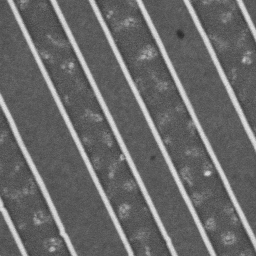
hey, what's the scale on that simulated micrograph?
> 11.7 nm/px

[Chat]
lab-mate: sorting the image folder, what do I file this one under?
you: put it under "one or a few lines or trenches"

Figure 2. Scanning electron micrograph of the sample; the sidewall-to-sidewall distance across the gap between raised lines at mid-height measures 0.498 micrometres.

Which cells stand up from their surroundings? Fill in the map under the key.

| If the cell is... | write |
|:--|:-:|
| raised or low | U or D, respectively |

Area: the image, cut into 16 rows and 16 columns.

UDDDUUDDDUUUDDDU
UDDDUUDDDUUUDDDD
UUDDDUUDDDUUUDDD
UUDDDUUDDDUUUDDD
UUUDDUUUDDDUUUDD
UUUDDDUUDDDUUUDD
UUUUDDUUUDDDUUUD
DUUUDDDUUDDDUUUD
DUUUUDDUUUDDDUUU
DDUUUDDDUUDDDUUU
DDUUUUDDUUUDDDUU
DDDUUUDDDUUDDDUU
DDDUUUUDDUUUDDDU
DDDUUUUDDDUUDDDU
UDDDUUUUDDUUUDDD
UDDDUUUUDDDUUDDD